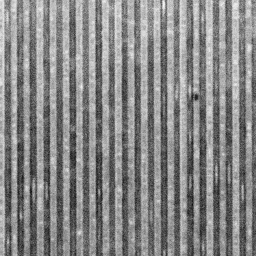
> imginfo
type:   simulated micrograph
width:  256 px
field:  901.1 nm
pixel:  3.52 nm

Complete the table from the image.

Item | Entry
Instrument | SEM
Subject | parallel lines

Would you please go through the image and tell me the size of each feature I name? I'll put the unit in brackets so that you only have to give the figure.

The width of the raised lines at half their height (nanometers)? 20.7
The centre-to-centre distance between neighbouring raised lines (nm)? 45.9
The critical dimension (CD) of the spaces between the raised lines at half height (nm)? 24.2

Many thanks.